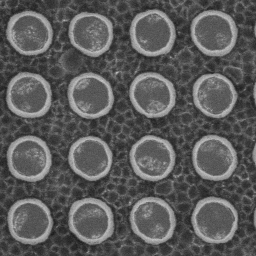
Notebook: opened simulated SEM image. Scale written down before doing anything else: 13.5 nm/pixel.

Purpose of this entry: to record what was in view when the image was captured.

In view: a regular array of raised bodies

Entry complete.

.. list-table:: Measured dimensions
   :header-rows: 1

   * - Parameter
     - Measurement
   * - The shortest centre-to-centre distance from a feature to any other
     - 61.4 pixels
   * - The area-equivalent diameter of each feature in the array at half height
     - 558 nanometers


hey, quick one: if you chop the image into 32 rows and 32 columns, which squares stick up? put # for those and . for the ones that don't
................................
...................#............
..###....####....####....####...
.#####...#####...#####..#####...
.#####...#####...#####..#####...
..####...#####...####....####...
...##......##.....##......##....
................................
................................
...#.......#......##......##....
.#####...####....####....####...
.#####...#####..######..#####...
.#####...#####...#####..#####...
..####...#####...####....####...
...........#....................
................................
................................
...##.....##......##.....###....
.#####...####....####...#####...
.#####...#####...#####..#####...
.#####...#####...####...#####...
..####....###....####....####...
................................
................................
................................
..###.....###....####....####...
.#####...#####...####...#####...
.#####...#####...####...######..
.#####...#####...####....####...
..####....###.....###....####...
................................
................................